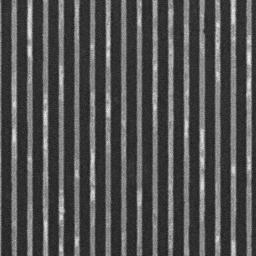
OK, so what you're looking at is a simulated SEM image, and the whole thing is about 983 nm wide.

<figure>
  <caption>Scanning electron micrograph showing parallel lines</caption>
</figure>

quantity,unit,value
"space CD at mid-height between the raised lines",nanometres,45.6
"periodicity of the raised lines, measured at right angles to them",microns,0.0602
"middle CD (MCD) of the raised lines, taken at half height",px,3.75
